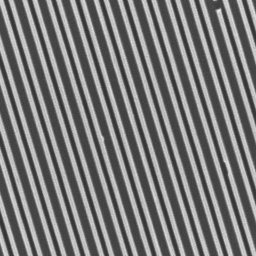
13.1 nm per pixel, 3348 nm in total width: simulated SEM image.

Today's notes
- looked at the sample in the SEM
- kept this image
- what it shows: parallel lines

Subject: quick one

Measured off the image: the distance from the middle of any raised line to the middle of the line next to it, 0.149 um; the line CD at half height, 62.6 nm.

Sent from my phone